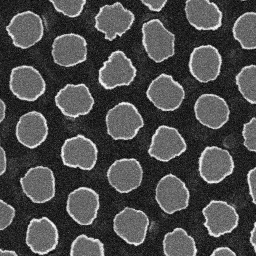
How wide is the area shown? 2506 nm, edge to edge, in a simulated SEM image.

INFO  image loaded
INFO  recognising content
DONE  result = a regular array of raised bodies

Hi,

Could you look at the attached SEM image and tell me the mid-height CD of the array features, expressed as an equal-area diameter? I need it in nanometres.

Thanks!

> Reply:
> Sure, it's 335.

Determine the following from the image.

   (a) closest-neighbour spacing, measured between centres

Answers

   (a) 479 nm